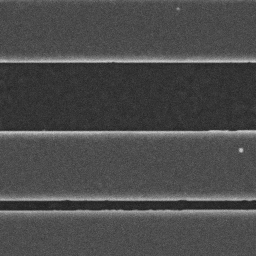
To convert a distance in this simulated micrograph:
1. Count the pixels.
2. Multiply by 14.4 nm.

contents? lines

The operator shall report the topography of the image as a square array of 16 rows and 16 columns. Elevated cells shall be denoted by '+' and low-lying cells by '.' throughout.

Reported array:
++++++++++++++++
++++++++++++++++
++++++++++++++++
++++++++++++++++
................
................
................
................
++++++++++++++++
++++++++++++++++
++++++++++++++++
++++++++++++++++
+++++++++++++++.
++++++++++++++++
++++++++++++++++
++++++++++++++++